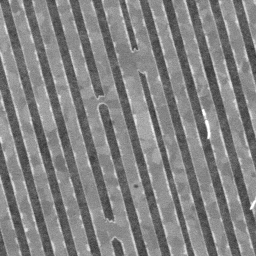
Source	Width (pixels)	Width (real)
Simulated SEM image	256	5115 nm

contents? parallel lines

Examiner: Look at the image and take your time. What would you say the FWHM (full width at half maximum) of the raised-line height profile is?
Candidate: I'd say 263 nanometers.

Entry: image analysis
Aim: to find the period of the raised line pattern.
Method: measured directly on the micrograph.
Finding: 450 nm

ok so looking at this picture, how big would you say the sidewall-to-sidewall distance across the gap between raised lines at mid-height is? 0.188 um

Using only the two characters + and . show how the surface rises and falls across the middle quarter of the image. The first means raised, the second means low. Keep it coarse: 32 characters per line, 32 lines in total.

..++++..++++..+++++++++...+++...
...+++..++++..+++++++++...+++...
...+++...+++...++++.++++..++++..
+..+++...+++...++++..+++..++++..
+..++++..++++..++++..+++...+++..
+...+++..++++..++++..++++..+++..
+...+++...+++...++++.++++..++++.
++..++++..+++...++++..+++...+++.
++..++++++++++..++++..+++...+++.
++...+++++++++..+++++.++++..+++.
+++..++++..+++...++++..+++..++++
+++..++++..+++...++++..+++...+++
+++...+++..++++..++++..+++...+++
+++...+++...+++...++++.++++..+++
++++..+++...+++...++++..+++..+++
.+++..++++..++++..++++..+++...++
.+++...+++..++++..++++..++++..++
.+++...+++...+++...++++.++++..++
.++++..++++..+++...++++..+++...+
..+++..++++..++++..++++..+++...+
..+++...+++...+++..+++++.++++..+
..++++..+++...+++...++++..+++..+
...+++..++++..+++...++++..+++...
...+++...+++..++++..++++..+++...
...+++...+++...+++...++++.++++..
+..++++..+++...+++...++++..+++..
+...+++..++++..++++..++++..+++..
+...+++...+++..++++..++++..++++.
++..+++...+++...+++...++++.++++.
++..++++..++++..+++...++++..+++.
++...+++..++++..++++..++++..+++.
++...+++...+++...+++..++++..++++